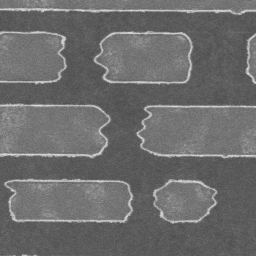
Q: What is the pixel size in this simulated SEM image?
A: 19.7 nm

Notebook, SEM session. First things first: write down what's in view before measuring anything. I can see one or a few lines or trenches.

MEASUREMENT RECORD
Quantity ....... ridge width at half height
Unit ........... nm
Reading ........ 503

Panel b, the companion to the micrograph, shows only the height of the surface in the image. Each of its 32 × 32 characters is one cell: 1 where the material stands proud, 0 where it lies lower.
00000000000000000000000000000000
11111111111111111111111111111011
11111111111111111111111111111111
11111111111111111111111111111111
00000000111111000000000111111111
00000000111110000000000011111110
00000000111110000000000011111110
00000000111100000000000011111110
00000000111110000000000011111110
00000001111110000000000111111110
11111111111111111111111111111111
11111111111111111111111111111111
11111111111111111111111111111111
00000000000011111110000000000000
00000000000001111110000000000000
00000000000001111100000000000000
00000000000001111100000000000000
00000000000001111100000000000000
00000000000001111100000000000000
11111111111111111111111111111111
11111111111111111111111111111111
11111111111111111111111111111111
11111111111111111111111111111111
10000000000000001111000000111111
11000000000000001111000000011111
10000000000000001110000000011111
10000000000000001111000000111111
11000000000000011111100001111111
11111111111111111111111111111111
11111111111111111111111111111111
11111111111111111111111111111111
11111111111111111111111111111111